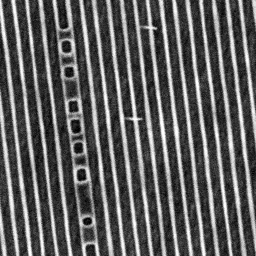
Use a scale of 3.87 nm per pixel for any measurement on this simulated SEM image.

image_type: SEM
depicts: parallel lines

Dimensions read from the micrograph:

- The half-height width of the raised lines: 10.3 nanometres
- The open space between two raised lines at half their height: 39 nm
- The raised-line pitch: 51.2 nanometers